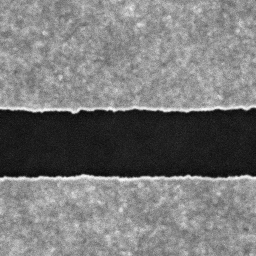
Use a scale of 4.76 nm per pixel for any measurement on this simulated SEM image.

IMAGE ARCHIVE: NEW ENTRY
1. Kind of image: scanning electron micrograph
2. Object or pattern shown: one or a few lines or trenches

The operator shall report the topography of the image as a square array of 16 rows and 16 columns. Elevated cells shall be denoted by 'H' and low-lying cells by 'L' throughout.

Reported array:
HHHHHHHHHHHHHHHH
HHHHHHHHHHHHHHHH
HHHHHHHHHHHHHHHH
HHHHHHHHHHHHHHHH
HHHHHHHHHHHHHHHH
HHHHHHHHHHHHHHHH
HHHHHHHHHHHHHHHH
LLLLLLLLLLLLLLLL
LLLLLLLLLLLLLLLL
LLLLLLLLLLLLLLLL
LLLLLLLLLLLLLLLL
HHHHHHHHHHHHHHHH
HHHHHHHHHHHHHHHH
HHHHHHHHHHHHHHHH
HHHHHHHHHHHHHHHH
HHHHHHHHHHHHHHHH